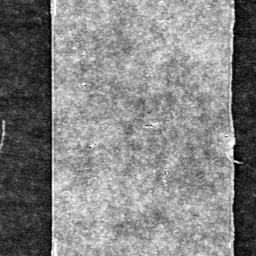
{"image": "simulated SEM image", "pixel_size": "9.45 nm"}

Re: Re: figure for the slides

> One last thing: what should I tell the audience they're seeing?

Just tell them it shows one or a few lines or trenches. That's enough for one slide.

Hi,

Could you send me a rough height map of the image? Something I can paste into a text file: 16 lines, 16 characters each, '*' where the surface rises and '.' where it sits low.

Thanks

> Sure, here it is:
...************.
...************.
...************.
...***********..
...***********..
...***********..
...***********..
...***********..
...************.
...************.
...************.
...************.
...************.
...************.
...************.
...************.